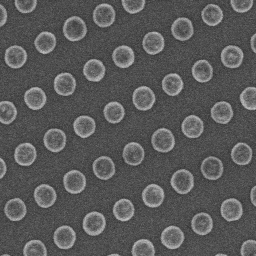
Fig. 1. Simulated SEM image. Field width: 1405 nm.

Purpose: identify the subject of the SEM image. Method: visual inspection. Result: a regular array of raised bodies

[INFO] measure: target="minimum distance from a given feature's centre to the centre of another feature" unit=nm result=178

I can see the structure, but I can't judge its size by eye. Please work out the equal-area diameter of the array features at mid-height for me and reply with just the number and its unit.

0.117 um